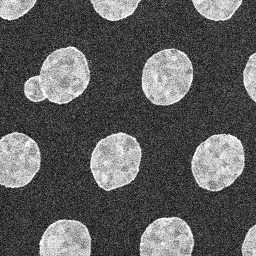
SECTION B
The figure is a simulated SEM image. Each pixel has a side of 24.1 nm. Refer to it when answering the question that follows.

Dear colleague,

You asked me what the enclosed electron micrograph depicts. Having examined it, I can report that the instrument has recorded raised bodies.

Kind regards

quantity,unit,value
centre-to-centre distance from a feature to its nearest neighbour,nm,2390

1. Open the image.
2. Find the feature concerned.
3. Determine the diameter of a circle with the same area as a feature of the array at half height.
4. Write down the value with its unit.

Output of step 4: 1290 nm